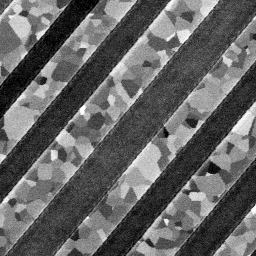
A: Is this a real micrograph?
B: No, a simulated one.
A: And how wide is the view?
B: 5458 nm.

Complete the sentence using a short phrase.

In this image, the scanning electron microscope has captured lines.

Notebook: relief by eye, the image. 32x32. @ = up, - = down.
-@@@@@@@@---@@@@@----@@@@@@-----
-@@@@@@@---@@@@@----@@@@@@------
@@@@@@@---@@@@@----@@@@@@-------
@@@@@@----@@@@-----@@@@@-------@
@@@@@----@@@@-----@@@@@@------@@
@@@@----@@@@@----@@@@@@------@@@
@@@----@@@@@----@@@@@@------@@@@
@@@---@@@@@----@@@@@@------@@@@@
@@---@@@@@----@@@@@@-------@@@@-
@----@@@@-----@@@@@-------@@@@--
----@@@@-----@@@@@@------@@@@---
---@@@@@----@@@@@@------@@@@@---
--@@@@@----@@@@@@------@@@@@----
-@@@@@----@@@@@@------@@@@@----@
@@@@@----@@@@@@-------@@@@----@@
@@@@----@@@@@@-------@@@@-----@@
@@@-----@@@@@-------@@@@-----@@@
@@-----@@@@@@------@@@@@----@@@@
@@----@@@@@@------@@@@@----@@@@@
@----@@@@@@------@@@@@----@@@@@@
----@@@@@@------@@@@@----@@@@@@-
---@@@@@@-------@@@@-----@@@@@--
---@@@@@@------@@@@-----@@@@@@--
--@@@@@@------@@@@-----@@@@@@---
-@@@@@@------@@@@@----@@@@@@----
@@@@@@------@@@@@----@@@@@@-----
@@@@@------@@@@@----@@@@@@-----@
@@@@-------@@@@----@@@@@@-----@@
@@@-------@@@@-----@@@@@@-----@@
@@@------@@@@-----@@@@@@-----@@@
@@------@@@@@----@@@@@@-----@@@@
@------@@@@@----@@@@@@-----@@@@@